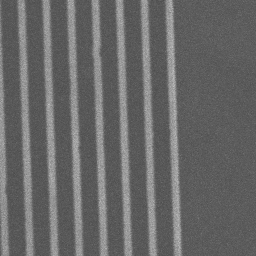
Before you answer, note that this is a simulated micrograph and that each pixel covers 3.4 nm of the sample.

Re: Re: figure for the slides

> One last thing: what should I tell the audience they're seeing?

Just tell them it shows parallel lines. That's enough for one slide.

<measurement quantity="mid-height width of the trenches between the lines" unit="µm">0.0641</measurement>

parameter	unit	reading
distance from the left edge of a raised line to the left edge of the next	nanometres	83.6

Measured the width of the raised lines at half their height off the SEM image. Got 20.4 nm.